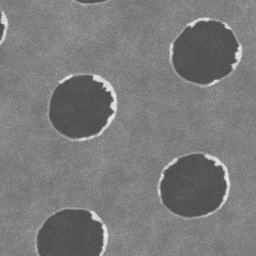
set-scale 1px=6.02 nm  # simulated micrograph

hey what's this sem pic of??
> holes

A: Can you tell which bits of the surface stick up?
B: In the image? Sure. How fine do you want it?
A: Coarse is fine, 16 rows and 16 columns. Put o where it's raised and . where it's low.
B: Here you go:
oooooooooooooooo
oooooooooooo..oo
ooooooooooo....o
ooooooooooo....o
ooooooooooo...oo
oooo...ooooooooo
ooo....ooooooooo
ooo....ooooooooo
oooo..oooooooooo
oooooooooooooooo
ooooooooooo...oo
oooooooooo....oo
oooooooooo....oo
ooo...ooooo.oooo
oo....oooooooooo
oo....oooooooooo